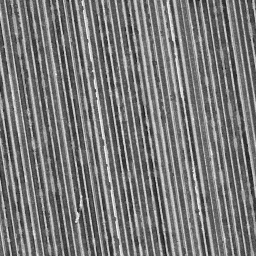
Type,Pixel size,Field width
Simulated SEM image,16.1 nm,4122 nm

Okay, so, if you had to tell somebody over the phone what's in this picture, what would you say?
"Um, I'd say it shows parallel lines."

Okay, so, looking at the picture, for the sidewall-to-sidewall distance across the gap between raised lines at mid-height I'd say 5.19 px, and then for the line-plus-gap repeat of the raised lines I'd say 104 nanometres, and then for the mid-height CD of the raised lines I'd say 27.8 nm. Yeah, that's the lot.